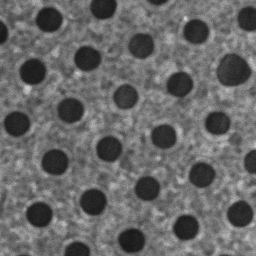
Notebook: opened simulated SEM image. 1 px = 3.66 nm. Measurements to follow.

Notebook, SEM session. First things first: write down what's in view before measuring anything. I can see a regular array of holes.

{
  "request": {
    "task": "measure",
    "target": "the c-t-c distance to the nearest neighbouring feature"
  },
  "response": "198 nm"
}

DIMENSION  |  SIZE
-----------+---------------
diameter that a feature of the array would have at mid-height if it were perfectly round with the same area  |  103 nanometers